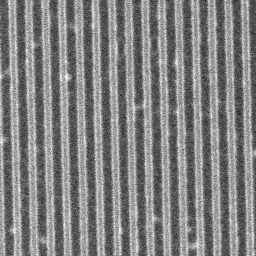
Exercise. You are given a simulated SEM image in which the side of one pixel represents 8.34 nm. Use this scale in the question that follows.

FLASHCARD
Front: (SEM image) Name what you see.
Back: parallel lines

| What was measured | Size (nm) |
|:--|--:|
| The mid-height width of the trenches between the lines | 35.5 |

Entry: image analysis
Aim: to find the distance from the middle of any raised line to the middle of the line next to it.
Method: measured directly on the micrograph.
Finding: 139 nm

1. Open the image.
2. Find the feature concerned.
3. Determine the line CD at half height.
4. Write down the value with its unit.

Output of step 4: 101 nanometers